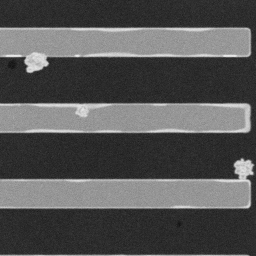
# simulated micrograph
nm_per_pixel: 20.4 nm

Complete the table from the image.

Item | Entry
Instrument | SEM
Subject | groups of lines, slits or small figures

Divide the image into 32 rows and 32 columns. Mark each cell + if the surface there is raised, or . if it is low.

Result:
................................
................................
................................
................................
+++++++++++++++++++++++++++++++.
+++++++++++++++++++++++++++++++.
+++++++++++++++++++++++++++++++.
...+++..........................
...++...........................
................................
................................
................................
................................
+++++++++++++++++++++++++++++++.
+++++++++++++++++++++++++++++++.
+++++++++++++++++++++++++++++++.
+++.............................
................................
................................
................................
..............................+.
..............................+.
..............................+.
+++++++++++++++++++++++++++++++.
+++++++++++++++++++++++++++++++.
+++++++++++++++++++++++++++++++.
................................
................................
................................
................................
................................
................................